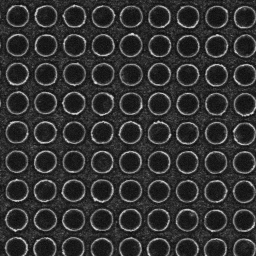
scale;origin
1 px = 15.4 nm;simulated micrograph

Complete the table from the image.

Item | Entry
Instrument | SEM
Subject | a regular array of raised bodies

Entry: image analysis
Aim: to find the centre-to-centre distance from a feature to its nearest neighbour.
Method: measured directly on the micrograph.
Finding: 435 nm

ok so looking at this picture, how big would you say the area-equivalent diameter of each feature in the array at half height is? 339 nanometres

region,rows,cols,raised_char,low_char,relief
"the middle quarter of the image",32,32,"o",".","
.ooo....oooo...ooo....ooo.....oo
ooooo..ooooo..ooooo..ooooo...ooo
ooooo..ooooo..ooooo..oooooo.oooo
ooooo..ooooo..ooooo..ooooo..oooo
.ooo....oooo...oooo...oooo...ooo
................................
................................
.ooo....ooo.....oo.....oo.....oo
ooooo...oooo..ooooo..ooooo...ooo
ooooo..ooooo..ooooo..oooooo.oooo
ooooo..ooooo..ooooo..oooooo.oooo
oooo....oooo...oooo...oooo...ooo
..oo.....oo............o......oo
................................
.........o......o......o........
ooooo...oooo...oooo...oooo...ooo
ooooo..ooooo..ooooo..ooooo..oooo
ooooo..ooooo..ooooo..oooooo.oooo
ooooo..ooooo..ooooo..ooooo..oooo
.ooo....ooo....ooo....ooo....ooo
................................
................................
.ooo....ooo....ooo....oooo...ooo
ooooo..ooooo..ooooo..ooooo..oooo
ooooo..ooooo..ooooo..ooooo..oooo
ooooo..ooooo..ooooo..ooooo..oooo
.ooo....ooo....ooo....oooo...ooo
................................
................................
.ooo....ooo....ooo....ooo....ooo
ooooo..ooooo..ooooo...oooo..oooo
ooooo..ooooo..ooooo..ooooo..oooo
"